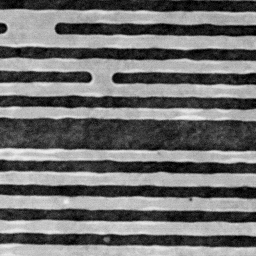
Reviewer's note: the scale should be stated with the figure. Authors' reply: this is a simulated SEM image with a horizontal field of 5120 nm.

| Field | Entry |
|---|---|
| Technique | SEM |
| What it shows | groups of lines, slits or small figures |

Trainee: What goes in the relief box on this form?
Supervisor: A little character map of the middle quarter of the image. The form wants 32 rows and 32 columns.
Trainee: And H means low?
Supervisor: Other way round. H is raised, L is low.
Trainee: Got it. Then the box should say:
HHHHHHHHHHHHHHHHHHHHHHHHHHHHHHHH
HHHHHHHHHHHHHHHHHHHHHHHHHHHHHHHH
LLLLLLLHHHHHLLLLLLLLLLLLLLLLLLLL
LLLLLLLHHHHHLLLLLLLLLLLLLLLLLLLL
LLLLLLLHHHHHLLLLLLLLLLLLLLLLLLLL
HHHHHHHHHHHHHHHHHHHHHHHHHHHHHHHH
HHHHHHHHHHHHHHHHHHHHHHHHHHHHHHHH
HHHHHHHHHHHHHHHHHHHHHHHHHHHHHHHH
LLLLLLLLLLLLLLLLLLLLLLLLLLLLLLLL
LLLLLLLLLLLLLLLLLLLLLLLLLLLLLLLL
LLLLLLLLLLLLLLLLLLLLLLLLLLLLLLLL
HHHHHHHHHHHHHHHHHHHHHHHHHHHHHHLL
HHHHHHHHHHHHHHHHHHHHHHHHHHHHHHHH
LLLLLLLLHHHHHHHHHHHHHHHHHHHHHHLH
LLLLLLLLLLLLLLLLLLLLLLLLLLLLLLLL
LLLLLLLLLLLLLLLLLLLLLLLLLLLLLLLL
LLLLLLLLLLLLLLLLLLLLLLLLLLLLLLLL
LLLLLLLLLLLLLLLLLLLLLLLLLLLLLLLL
LLLLLLLLLLLLLLLLLLLLLLLLLLLLLLLL
LLLLLLLLLLLLLLLLLLLLLLLLLLLLLLLL
LLLLLLLLLLLLLLLLLLLLLLLLLLLLLLLL
LLLLLLLLLLLLLLLLLLLLLLLLLLLLLLLL
HHHHHHHHHHHHHHHHHHHHHHHHHHHHHHHH
HHHHHHHHHHHHHHHHHHHHHHHHHHHHHHHH
LLLLLLLLLLLLLLLLLLLLLLLLLLLLLLLL
LLLLLLLLLLLLLLLLLLLLLLLLLLLLLLLL
LLLLLLLLLLLLLLLLLLLLLLLLLLLLLLLL
HHHHHHHLLLHHHHHHHHHHHHHHHHHHHHLH
HHHHHHHHHHHHHHHHHHHHHHHHHHHHHHHH
HHHHHHHHHHHHHHHHHHHHHHHHHHHHHHHH
LLLLLLLLLLLLLLLLLLLLLLLLLLLLLLLL
LLLLLLLLLLLLLLLLLLLLLLLLLLLLLLLL